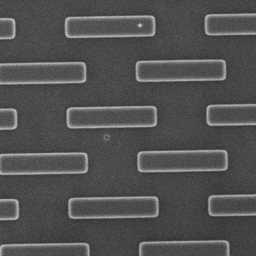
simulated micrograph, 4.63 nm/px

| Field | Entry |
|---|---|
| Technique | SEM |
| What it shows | groups of lines, slits or small figures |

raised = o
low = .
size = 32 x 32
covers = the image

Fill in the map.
................................
................................
oo......ooooooooooo.......oooooo
oo......ooooooooooo.......oooooo
oo.......oooooooo...............
................................
................................
................................
ooooooooooo......ooooooooooo....
ooooooooooo......ooooooooooo....
................................
................................
................................
.........oooooooooo.......oooooo
oo......oooooooooooo......oooooo
oo.......oooooooooo.......ooooo.
................................
................................
................................
ooooooooooo......ooooooooooo....
ooooooooooo......ooooooooooo....
ooooooooooo.....................
................................
................................
............................oooo
oo.......ooooooooooo......oooooo
oo.......ooooooooooo......oooooo
................................
................................
................................
........ooo.......oooooooooo....
ooooooooooo......oooooooooooo...